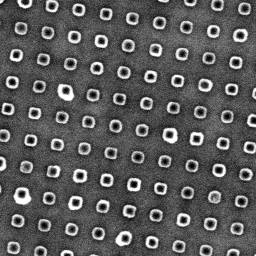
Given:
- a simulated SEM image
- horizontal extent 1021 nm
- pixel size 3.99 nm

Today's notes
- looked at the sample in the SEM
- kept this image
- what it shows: a regular array of raised bodies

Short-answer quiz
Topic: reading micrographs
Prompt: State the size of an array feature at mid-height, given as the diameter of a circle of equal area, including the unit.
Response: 49.1 nanometers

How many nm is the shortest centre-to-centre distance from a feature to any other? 108